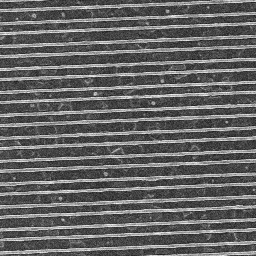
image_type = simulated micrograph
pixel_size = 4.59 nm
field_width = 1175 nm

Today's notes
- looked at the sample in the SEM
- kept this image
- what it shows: parallel lines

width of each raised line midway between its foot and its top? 13.2 nanometers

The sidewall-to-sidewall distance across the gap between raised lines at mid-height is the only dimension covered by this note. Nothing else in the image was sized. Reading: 42.4 nm